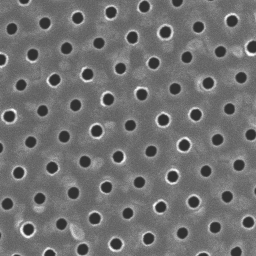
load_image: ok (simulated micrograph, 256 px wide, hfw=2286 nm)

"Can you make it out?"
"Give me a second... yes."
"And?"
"a regular array of holes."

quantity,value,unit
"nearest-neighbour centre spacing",294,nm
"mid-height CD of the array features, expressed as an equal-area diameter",99.2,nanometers